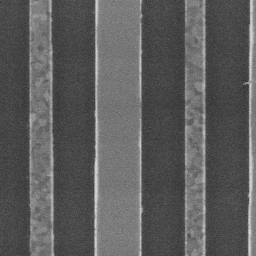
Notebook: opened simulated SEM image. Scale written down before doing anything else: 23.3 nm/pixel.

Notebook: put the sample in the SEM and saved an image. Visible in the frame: lines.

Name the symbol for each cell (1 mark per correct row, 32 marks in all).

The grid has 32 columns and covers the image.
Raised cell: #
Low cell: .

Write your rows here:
....##......######.....###.....#
....##......######.....###.....#
....##......######.....###.....#
....##......######.....###.....#
....##......######.....###.....#
....##......######.....###.....#
....##......######.....###.....#
....##......######.....###.....#
....##......######.....###.....#
....##......######.....###.....#
....##......######.....###.....#
....##......######.....###.....#
....##......######.....###.....#
....##......######.....###.....#
....##......######.....###.....#
....##......######.....###.....#
....##......######.....###.....#
....##......######.....###.....#
....##......######.....###.....#
....###.....######.....###.....#
....###.....######.....###.....#
....###.....######.....###.....#
....###.....######.....###.....#
....###.....######.....###.....#
....###.....######.....###.....#
....###.....######.....###.....#
....###.....######.....###.....#
....###.....######.....###.....#
....###.....######.....###.....#
....###.....######.....###.....#
....###.....######.....###.....#
....###.....######.....###.....#